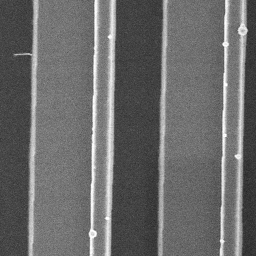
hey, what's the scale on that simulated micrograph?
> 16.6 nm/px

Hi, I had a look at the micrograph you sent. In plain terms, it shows lines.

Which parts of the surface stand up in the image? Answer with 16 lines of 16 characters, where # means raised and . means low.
..#####...#####.
..#####...#####.
..#####...#####.
..#####...#####.
..#####...#####.
..#####...#####.
..#####...#####.
..#####...#####.
..#####...#####.
..#####...#####.
..#####...#####.
..#####...#####.
..#####...#####.
..#####...#####.
..#####...#####.
..#####...#####.